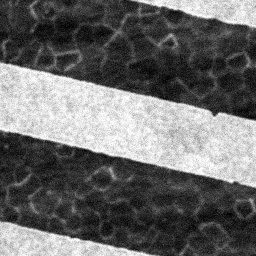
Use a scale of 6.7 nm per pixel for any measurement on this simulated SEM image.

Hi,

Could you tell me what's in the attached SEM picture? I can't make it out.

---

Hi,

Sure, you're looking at one or a few lines or trenches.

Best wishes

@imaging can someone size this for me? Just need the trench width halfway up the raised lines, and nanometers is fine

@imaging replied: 610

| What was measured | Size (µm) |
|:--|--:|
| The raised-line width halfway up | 0.427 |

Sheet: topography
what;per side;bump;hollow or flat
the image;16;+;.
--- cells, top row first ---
...........+++++
...............+
................
................
++..............
+++++++.........
+++++++++++.....
+++++++++++++++.
..++++++++++++++
......++++++++++
...........+++++
...............+
................
................
+++.............
+++++++.........